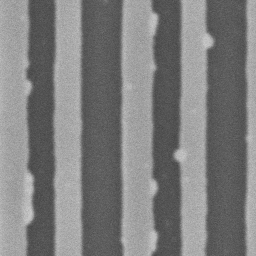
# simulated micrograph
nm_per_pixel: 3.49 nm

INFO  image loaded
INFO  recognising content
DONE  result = lines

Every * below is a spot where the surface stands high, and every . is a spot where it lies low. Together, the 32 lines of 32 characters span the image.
***....***.....****....***.....*
***....***.....****....***.....*
****...***.....****....***.....*
****...***.....****....***.....*
***....***.....****....***.....*
***....***.....****....****....*
***....***.....****....***.....*
***....***.....****....***.....*
***....***.....****....***.....*
***....***.....****....***.....*
***....***.....****....***.....*
***....***.....****....***.....*
***....***.....****....***.....*
***....***.....****....***.....*
***....***.....****....***.....*
***....***.....****....***.....*
***....***.....****....***.....*
***....***.....****....***.....*
****...***.....****...****.....*
***....***.....****...****.....*
***....***.....****...****.....*
***....***.....****....***.....*
***....***.....****....***.....*
***....***.....****....***.....*
***....***.....****....***.....*
***....***.....****....***.....*
***....***.....****....***.....*
***....***.....****....***.....*
***....***.....****....***.....*
***....***.....****....***.....*
***....***.....****....***.....*
***....***......***....***.....*